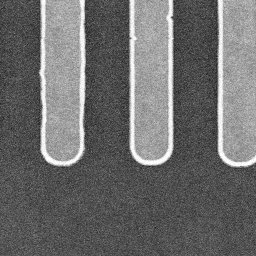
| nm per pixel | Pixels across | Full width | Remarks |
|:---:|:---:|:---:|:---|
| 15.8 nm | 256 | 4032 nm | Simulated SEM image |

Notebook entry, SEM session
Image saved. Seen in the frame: one or a few lines or trenches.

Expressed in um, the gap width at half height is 0.797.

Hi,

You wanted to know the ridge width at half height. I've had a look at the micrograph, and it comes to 0.589 micrometres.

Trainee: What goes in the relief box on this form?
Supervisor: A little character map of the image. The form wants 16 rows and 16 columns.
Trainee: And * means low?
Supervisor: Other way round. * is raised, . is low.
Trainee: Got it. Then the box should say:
...**...***...**
...**...***...**
...**...***...**
...**...***...**
...**...***...**
...**...***...**
...**...***...**
...**...***...**
...**...***...**
...**...***...**
................
................
................
................
................
................